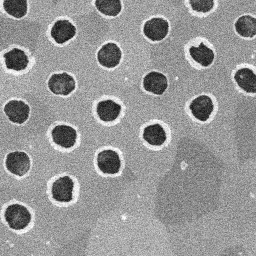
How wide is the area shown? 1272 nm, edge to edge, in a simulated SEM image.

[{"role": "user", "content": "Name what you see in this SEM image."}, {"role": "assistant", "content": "a regular array of holes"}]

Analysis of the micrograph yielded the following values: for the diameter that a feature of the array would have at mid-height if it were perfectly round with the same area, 125 nm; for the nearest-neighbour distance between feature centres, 0.256 µm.